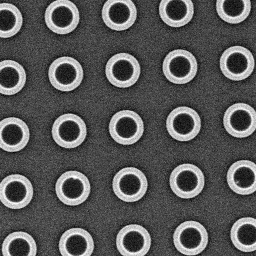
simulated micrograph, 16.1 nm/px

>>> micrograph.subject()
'an array of small figures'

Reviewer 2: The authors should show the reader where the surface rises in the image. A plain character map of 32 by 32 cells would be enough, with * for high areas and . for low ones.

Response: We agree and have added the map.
*.....***....****...****...****.
**....****...****...****...****.
***...****...****...****....**..
***...***.....**................
*...............................
................................
.....................***....***.
.......**.....***....***....****
***...****...****...*****...****
***...****...****....***....***.
***....***....***...............
**..............................
................................
......................**.....**.
........**....***....****...****
***....****...****...****...****
****...****...****...****....***
****...***....***.....**........
***.............................
................................
.............................***
........**.....***....***....***
****...****...****...****...****
****...****...****...****....***
****...****....***....**........
.**.....**......................
................................
..............................**
...............***....***....***
.***....***....****...****...***
****...*****...****...****...***
*****...***....***.....**.......